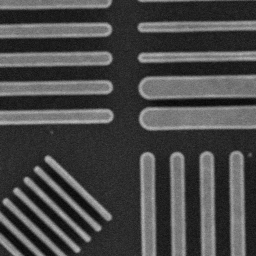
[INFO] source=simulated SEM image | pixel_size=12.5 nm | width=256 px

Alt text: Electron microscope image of groups of lines, slits or small figures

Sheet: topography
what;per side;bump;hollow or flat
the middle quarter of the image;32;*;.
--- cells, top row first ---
................................
................................
................................
......................**********
.........**........*************
************.......*************
************.......*************
...................*************
................................
................................
................................
....................************
************.......*************
************.......*************
...................*************
....................************
................................
................................
................................
................................
................................
................................
....................**.....**...
...................***.....***..
...................***.....***..
...................***.....***..
...................***.....***..
*...................**.....***..
**..................**.....***..
.**.................**.....***..
..**................**.....***..
...**...............**.....***..